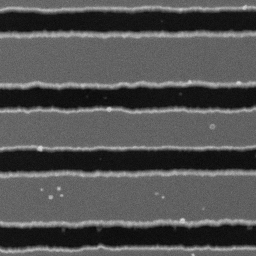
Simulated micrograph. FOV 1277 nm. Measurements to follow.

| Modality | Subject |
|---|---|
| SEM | lines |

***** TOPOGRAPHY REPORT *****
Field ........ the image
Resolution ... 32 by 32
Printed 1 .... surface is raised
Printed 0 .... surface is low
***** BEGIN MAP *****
11111111111111111111111111111111
00001111000000000000000000000000
00000000000000000000000000000000
00000000000000000000000000000000
11111111111111111111111111111111
11111111111111111111111111111111
11111111111111111111111111111111
11111111111111111111111111111111
11111111111111111111111111111111
11111111111111111111111111111111
11111111111111111111111111111111
00000000000000000000000000000000
00000000000000000000000000000000
00001010000011100000011000000001
11111111111111111111111111111111
11111111111111111111111111111111
11111111111111111111111111111111
11111111111111111111111111111111
11111111111111111111111111111111
00000000000000000000000000000000
00000000000000000000000000000000
00000011111011000111111111111111
11111111111111111111111111111111
11111111111111111111111111111111
11111111111111111111111111111111
11111111111111111111111111111111
11111111111111111111111111111111
11111111111111111111111111111111
00000000000000000000000000000000
00000000000000000000000000000000
00000000000000000000000000000000
11111111111111111111111111111111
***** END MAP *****